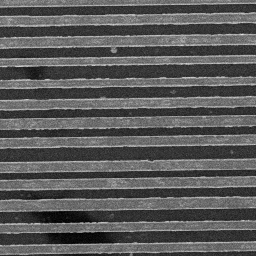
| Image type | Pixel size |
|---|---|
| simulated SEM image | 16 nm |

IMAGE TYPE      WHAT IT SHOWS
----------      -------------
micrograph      parallel lines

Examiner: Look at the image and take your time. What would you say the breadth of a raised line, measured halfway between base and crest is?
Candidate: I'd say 0.148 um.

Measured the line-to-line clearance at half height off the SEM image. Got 178 nm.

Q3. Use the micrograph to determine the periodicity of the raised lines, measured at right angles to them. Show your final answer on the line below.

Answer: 20.8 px